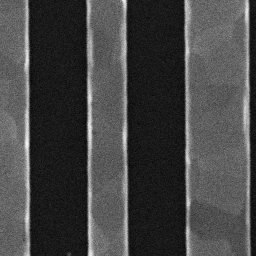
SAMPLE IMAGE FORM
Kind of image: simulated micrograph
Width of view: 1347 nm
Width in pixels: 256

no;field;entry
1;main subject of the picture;wiring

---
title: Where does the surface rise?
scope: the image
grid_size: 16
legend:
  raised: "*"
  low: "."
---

**...***....****
**...***....****
**...***....****
**...***....****
**...***....****
**...***....****
**...***....****
**...***....****
**....**....****
**....**....****
**...***....****
**....**....****
**....**....****
**....**....****
**....**....****
**....**....****